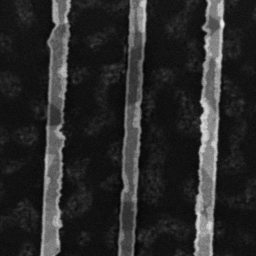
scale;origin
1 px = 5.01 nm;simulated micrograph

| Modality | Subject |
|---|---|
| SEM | one or a few lines or trenches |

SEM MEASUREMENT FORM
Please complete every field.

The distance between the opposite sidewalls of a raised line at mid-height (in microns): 0.0714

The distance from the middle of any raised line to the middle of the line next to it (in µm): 0.386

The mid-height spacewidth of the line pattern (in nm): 316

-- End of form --